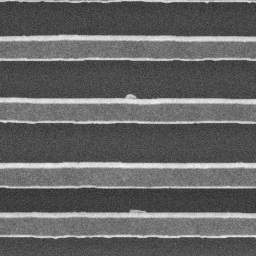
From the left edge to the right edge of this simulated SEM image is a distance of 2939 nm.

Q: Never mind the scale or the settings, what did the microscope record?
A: lines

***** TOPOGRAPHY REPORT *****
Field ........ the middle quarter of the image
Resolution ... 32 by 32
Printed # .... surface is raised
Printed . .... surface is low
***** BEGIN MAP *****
................................
................................
................................
................................
................................
................................
................................
................................
................................
################################
################################
################################
################################
################################
################################
................................
................................
................................
................................
................................
................................
................................
................................
................................
................................
########################..#.....
################################
################################
################################
################################
################################
................................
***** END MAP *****